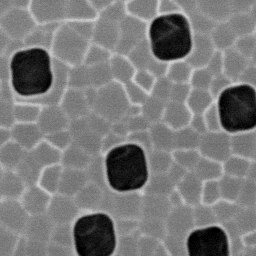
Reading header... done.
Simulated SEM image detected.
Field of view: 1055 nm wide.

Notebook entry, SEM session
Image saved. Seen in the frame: holes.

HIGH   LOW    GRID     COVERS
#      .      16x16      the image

################
##########..####
#########...####
#..#######..####
#..#############
#..###########..
##############..
##############..
################
#######..#######
#######..#######
#######..#######
################
#####..#########
#####..#####..##
#####..#####..##